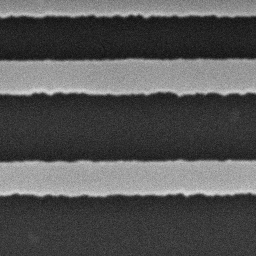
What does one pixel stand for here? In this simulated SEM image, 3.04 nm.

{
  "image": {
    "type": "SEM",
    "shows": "lines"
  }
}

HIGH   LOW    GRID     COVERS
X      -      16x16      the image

XXXXXXXXXXXXXXXX
----------------
----------------
----------------
XXXXXXXXXXXXXXXX
XXXXXXXXXXXXXXXX
----------------
----------------
----------------
----------------
XXXXXXXXXXXXXXXX
XXXXXXXXXXXXXXXX
----------------
----------------
----------------
----------------